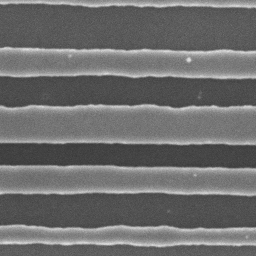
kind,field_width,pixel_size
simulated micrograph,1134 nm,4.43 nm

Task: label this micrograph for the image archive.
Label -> lines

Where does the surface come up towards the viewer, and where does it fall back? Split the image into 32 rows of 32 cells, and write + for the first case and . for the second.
.........+++++++++++++++++++++++
................................
................................
................................
................................
................................
++++++++++++++++++++++++++++++++
++++++++++++++++++++++++++++++++
++++++++++++++++++++++++++++++++
.+++............++++++++++++++++
................................
................................
................................
++++++++++++++++++++++++++++++++
++++++++++++++++++++++++++++++++
++++++++++++++++++++++++++++++++
++++++++++++++++++++++++++++++++
++++++++++++++++++++++++++++++++
................................
................................
................................
++++++++++++++++++++++++++++++++
++++++++++++++++++++++++++++++++
++++++++++++++++++++++++++++++++
................................
................................
................................
................................
++++++.......+++++++++..........
++++++++++++++++++++++++++++++++
........+...++..++++++++..++++++
................................